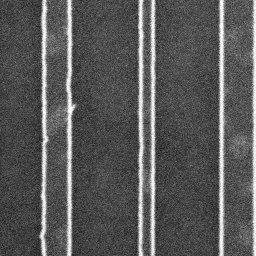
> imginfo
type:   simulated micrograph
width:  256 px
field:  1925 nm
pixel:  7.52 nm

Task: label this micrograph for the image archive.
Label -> one or a few lines or trenches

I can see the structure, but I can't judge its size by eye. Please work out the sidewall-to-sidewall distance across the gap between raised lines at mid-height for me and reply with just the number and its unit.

68.5 px